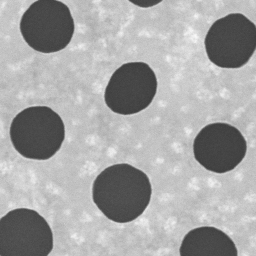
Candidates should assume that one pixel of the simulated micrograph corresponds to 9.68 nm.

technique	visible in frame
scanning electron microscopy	holes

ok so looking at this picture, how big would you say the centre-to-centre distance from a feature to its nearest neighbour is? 1000 nanometres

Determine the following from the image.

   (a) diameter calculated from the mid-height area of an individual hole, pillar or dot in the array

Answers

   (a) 0.519 microns